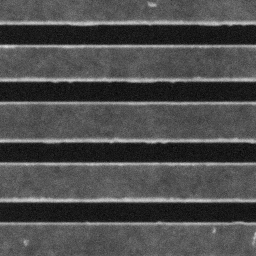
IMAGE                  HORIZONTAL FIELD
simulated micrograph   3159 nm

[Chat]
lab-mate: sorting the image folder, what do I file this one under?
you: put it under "lines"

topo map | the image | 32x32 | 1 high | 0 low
11111111111111111111111111111111
11111111111111111111111111111111
11111111111111111111111111111111
00000000000000000000000000000000
00000000000000000000000000000000
00000000000000000000000000000000
11111111111111111111111111111111
11111111111111111111111111111111
11111111111111111111111111111111
11111111111111111111111111111111
00000000000000000000000000000000
00000000000000000000000000000000
00000000000000000000000000000000
11111111111111111111111111111111
11111111111111111111111111111111
11111111111111111111111111111111
11111111111111111111111111111111
11111111111111111111111111111111
00000000000000000000000000000000
00000000000000000000000000000000
11111111111111111111111111111111
11111111111111111111111111111111
11111111111111111111111111111111
11111111111111111111111111111111
11111111111111111111111111111111
00000000000000000000000000000000
00000000000000000000000000000000
00000000000000000000000000000000
11111111111111111111111111111111
11111111111111111111111111111111
11111111111111111111111111111111
11111111111111111111111111111111